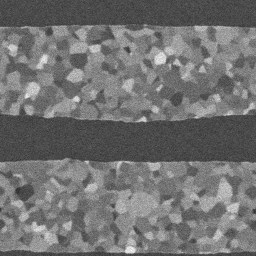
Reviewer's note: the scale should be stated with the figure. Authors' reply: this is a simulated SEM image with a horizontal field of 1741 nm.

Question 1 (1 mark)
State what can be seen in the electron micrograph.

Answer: one or a few lines or trenches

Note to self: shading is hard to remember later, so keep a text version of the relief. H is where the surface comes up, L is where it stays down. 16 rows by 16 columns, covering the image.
LLLLLLLLLLLLLLLL
LLLLLLLLLLLLLLLL
HHHHHHHHHHHHHHHH
HHHHHHHHHHHHHHHH
HHHHHHHHHHHHHHHH
HHHHHHHHHHHHHHHH
HHHHHHHHHHHHHHHH
LLLLLLLHHHHLLLLL
LLLLLLLLLLLLLLLL
LLLLLLLLLLLLLLLL
HHHHHHHHHHHHHHHH
HHHHHHHHHHHHHHHH
HHHHHHHHHHHHHHHH
HHHHHHHHHHHHHHHH
HHHHHHHHHHHHHHHH
HHHHHHHHHHHHHHHH